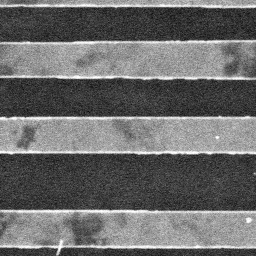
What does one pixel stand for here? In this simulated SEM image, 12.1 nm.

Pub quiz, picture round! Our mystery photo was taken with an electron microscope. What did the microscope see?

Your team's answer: lines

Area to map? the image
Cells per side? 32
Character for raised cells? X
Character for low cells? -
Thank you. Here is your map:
XXXXXXXXXXXXXXXXXXXXXXXXXXXXXXXX
--------------------------------
--------------------------------
--------------------------------
--------------------------------
XXXXXXXXXXXXXXXXXXXXXXXXXXXXXXXX
XXXXXXXXXXXXXXXXXXXXXXXXXXXXXXXX
XXXXXXXXXXXXXXXXXXXXXXXXXXXXXXXX
XXXXXXXXXXXXXXXXXXXXXXXXXXXXXXXX
XXXXXXXXXXXXXXXXXXXXXXXXXXXXXXXX
--------------------------------
--------------------------------
--------------------------------
--------------------------------
--------------------------------
XXXXXXXXXXXXXXXXXXXXXXXXXXXXXXXX
XXXXXXXXXXXXXXXXXXXXXXXXXXXXXXXX
XXXXXXXXXXXXXXXXXXXXXXXXXXXXXXXX
XXXXXXXXXXXXXXXXXXXXXXXXXXXXXXXX
--------------------------------
--------------------------------
--------------------------------
--------------------------------
--------------------------------
--------------------------------
--------------------------------
XXXXXXXXXXXXXXXXXXXXXXXXXXXXXXXX
XXXXXXXXXXXXXXXXXXXXXXXXXXXXXXXX
XXXXXXXXXXXXXXXXXXXXXXXXXXXXXXXX
XXXXXXXXXXXXXXXXXXXXXXXXXXXXXXXX
XXXXXXXXXXXXXXXXXXXXXXXXXXXXXXXX
--------------------------------